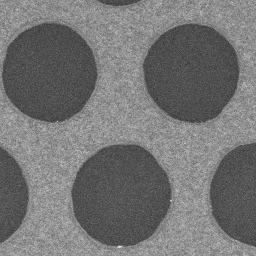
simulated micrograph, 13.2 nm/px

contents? holes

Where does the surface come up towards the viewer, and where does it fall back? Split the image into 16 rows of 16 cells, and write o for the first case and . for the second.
oooooooooooooooo
ooo.oooooooooooo
o....ooooo....oo
......ooo......o
......ooo......o
......ooo......o
o....ooooo....oo
oo..ooooooo..ooo
oooooooooooooooo
oooooo...ooooo..
.oooo.....oooo..
..ooo......oo...
..ooo......oo...
..ooo.....ooo...
.oooo.....oooo..
oooooooooooooooo